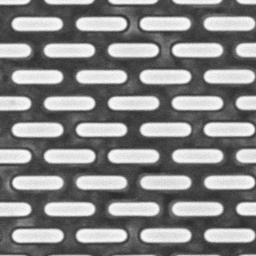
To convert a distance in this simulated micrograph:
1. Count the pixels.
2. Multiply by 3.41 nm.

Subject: groups of lines, slits or small figures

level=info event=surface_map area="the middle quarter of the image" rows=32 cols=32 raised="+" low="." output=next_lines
................................
................................
...++++++++++++....++++++++++++.
...+++++++++++++...++++++++++++.
....+++++++++++.....+++++++++++.
................................
................................
................................
+++++++.....+++++++++++.....++++
++++++++...+++++++++++++...+++++
++++++++...++++++++++++....+++++
................................
................................
................................
................................
....+++++++++++....++++++++++++.
...+++++++++++++...+++++++++++++
...++++++++++++....++++++++++++.
................................
................................
................................
+++++++.....++++++++++......++++
++++++++...+++++++++++++...+++++
++++++++...+++++++++++++...+++++
+++++++.....++++++++++......++++
................................
................................
................................
....+++++++++++.....+++++++++++.
...+++++++++++++...+++++++++++++
...++++++++++++....++++++++++++.
................................